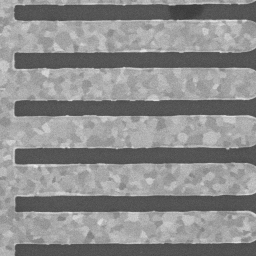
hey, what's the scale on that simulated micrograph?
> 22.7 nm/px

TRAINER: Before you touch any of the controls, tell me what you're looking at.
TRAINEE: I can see groups of lines, slits or small figures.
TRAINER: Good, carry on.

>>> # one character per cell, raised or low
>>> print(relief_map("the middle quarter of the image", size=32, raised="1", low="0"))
00000000000000000000000000000000
11111111111111111111111111111111
11111111111111111111111111111111
11111111111111111111111111111111
11111111111111111111111111111111
11111111111111111111111111111111
11111111111111111111111111111111
11111111111111111111111111111111
11111111111111111111111111111111
00000000000000000000000000000000
00000000000000000000000000000000
00000000000000000000000000000000
00000000000000000000000000000000
11111111111111111111111111111111
11111111111111111111111111111111
11111111111111111111111111111111
11111111111111111111111111111111
11111111111111111111111111111111
11111111111111111111111111111111
11111111111111111111111111111111
11111111111111111111111111111111
00000000000000000000000000000000
00000000000000000000000000000000
00000000000000000000000000000000
00000000000000000000000000000000
11111111111111111111111111111111
11111111111111111111111111111111
11111111111111111111111111111111
11111111111111111111111111111111
11111111111111111111111111111111
11111111111111111111111111111111
11111111111111111111111111111111